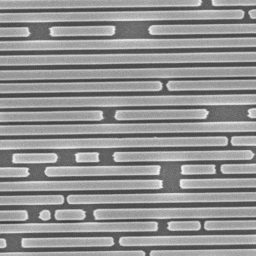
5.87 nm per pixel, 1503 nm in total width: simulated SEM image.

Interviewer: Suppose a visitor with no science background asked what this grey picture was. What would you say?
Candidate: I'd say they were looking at parallel lines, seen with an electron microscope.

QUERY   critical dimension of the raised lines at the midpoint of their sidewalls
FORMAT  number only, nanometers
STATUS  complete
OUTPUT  52.8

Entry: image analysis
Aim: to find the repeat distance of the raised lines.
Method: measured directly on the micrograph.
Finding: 82.6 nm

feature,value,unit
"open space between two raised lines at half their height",0.0316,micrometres